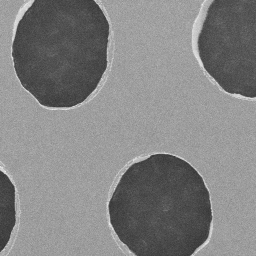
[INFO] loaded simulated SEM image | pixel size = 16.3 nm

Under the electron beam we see holes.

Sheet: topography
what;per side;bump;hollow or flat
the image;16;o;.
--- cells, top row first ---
oo....ooooooo...
o......oooooo...
o......ooooo....
o......ooooo....
o......oooooo...
oo....oooooooo..
ooo..ooooooooooo
oooooooooooooooo
oooooooooooooooo
oooooooooooooooo
oooooooo....oooo
.oooooo......ooo
.oooooo......ooo
.oooooo......ooo
.oooooo......ooo
oooooooo....oooo